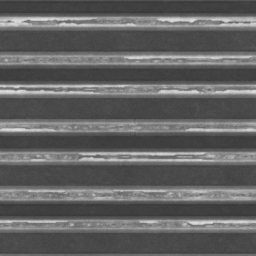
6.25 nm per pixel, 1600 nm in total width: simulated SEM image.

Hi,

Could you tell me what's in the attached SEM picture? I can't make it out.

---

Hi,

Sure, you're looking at parallel lines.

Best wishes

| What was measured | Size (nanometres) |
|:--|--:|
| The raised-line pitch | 211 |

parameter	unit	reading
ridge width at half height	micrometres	0.0727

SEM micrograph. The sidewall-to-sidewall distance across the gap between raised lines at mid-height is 135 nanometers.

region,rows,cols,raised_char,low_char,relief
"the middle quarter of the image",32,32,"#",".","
................................
................................
................................
................................
................................
################################
################################
################################
................................
................................
................................
................................
................................
................................
................................
################################
################################
................................
................................
................................
................................
................................
################################
################################
.......................#####....
................................
................................
................................
................................
................................
................................
################################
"